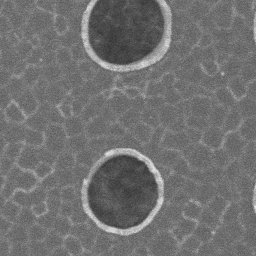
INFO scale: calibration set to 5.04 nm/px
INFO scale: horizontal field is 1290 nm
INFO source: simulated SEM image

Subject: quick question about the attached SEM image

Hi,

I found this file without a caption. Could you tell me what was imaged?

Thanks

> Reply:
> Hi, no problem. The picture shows holes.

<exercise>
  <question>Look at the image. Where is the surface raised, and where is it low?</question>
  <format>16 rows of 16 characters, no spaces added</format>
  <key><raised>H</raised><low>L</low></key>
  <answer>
HHHHHHLLLLHHHHHH
HHHHHHLLLLHHHHHH
HHHHHHLLLLHHHHHH
HHHHHHLLLHHHHHHH
HHHHHHHHHHHHHHHH
HHHHHHHHHHHHHHHH
HHHHHHHHHHHHHHHH
HHHHHHHHHHHHHHHH
HHHHHHHHHHHHHHHH
HHHHHHHHHHHHHHHH
HHHHHHLLLHHHHHHH
HHHHHHLLLLHHHHHH
HHHHHHLLLLHHHHHH
HHHHHHLLLHHHHHHH
HHHHHHHHHHHHHHHH
HHHHHHHHHHHHHHHH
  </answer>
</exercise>